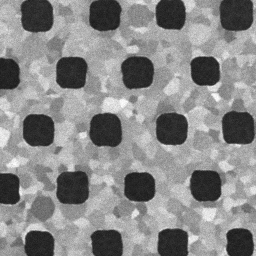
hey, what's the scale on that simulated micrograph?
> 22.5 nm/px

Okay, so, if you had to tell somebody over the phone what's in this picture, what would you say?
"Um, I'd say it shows a regular array of holes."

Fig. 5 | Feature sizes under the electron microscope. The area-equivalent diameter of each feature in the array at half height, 769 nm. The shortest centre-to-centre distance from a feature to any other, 1490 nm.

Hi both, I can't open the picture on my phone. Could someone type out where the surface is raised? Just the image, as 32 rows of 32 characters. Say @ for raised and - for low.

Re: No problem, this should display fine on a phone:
@@@---@@@@@----@@@@@---@@@@@----
@@@----@@@@----@@@@----@@@@-----
@@@----@@@@----@@@@@---@@@@@----
@@@---@@@@@@---@@@@@---@@@@@---@
@@@@@@@@@@@@@@@@@@@@@@@@@@@@@@@@
@@@@@@@@@@@@@@@@@@@@@@@@@@@@@@@@
@@@@@@@@@@@@@@@@@@@@@@@@@@@@@@@@
--@@@@@----@@@@@---@@@@@---@@@@@
--@@@@@----@@@@----@@@@@---@@@@@
--@@@@@----@@@@----@@@@@----@@@@
--@@@@@----@@@@@---@@@@@@--@@@@@
@@@@@@@@@@@@@@@@@@@@@@@@@@@@@@@@
@@@@@@@@@@@@@@@@@@@@@@@@@@@@@@@@
@@@@@@@@@@@@@@@@@@@@@@@@@@@@@@@@
@@@---@@@@@@---@@@@@---@@@@@---@
@@@----@@@@----@@@@----@@@@@----
@@@----@@@@----@@@@----@@@@@----
@@@----@@@@----@@@@@---@@@@@----
@@@@@@@@@@@@@@@@@@@@@@@@@@@@@@@@
@@@@@@@@@@@@@@@@@@@@@@@@@@@@@@@@
@@@@@@@@@@@@@@@@@@@@@@@@@@@@@@@@
@@@@@@@@--@@@@@@@-@@@@@@---@@@@@
--@@@@@----@@@@@---@@@@@----@@@@
--@@@@@----@@@@@----@@@@----@@@@
---@@@@----@@@@@---@@@@@----@@@@
--@@@@@@--@@@@@@@@@@@@@@@@@@@@@@
@@@@@@@@@@@@@@@@@@@@@@@@@@@@@@@@
@@@@@@@@@@@@@@@@@@@@@@@@@@@@@@@@
@@@@@@@@@@@@@@@@@@@@@@@@@@@@@-@@
@@@----@@@@----@@@@@----@@@@----
@@@----@@@@----@@@@@----@@@@----
@@@----@@@@@---@@@@@----@@@@----